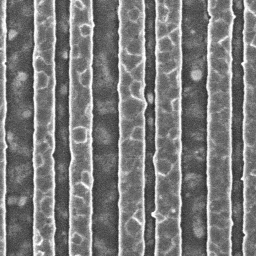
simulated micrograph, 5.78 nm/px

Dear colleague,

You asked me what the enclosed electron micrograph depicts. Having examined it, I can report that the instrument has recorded parallel lines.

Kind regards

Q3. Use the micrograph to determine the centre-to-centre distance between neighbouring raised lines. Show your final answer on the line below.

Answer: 253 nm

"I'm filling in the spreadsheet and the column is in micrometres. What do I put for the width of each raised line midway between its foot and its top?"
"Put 0.137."